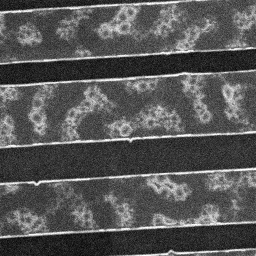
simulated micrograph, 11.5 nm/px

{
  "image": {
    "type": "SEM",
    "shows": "one or a few lines or trenches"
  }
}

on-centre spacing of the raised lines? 1010 nm